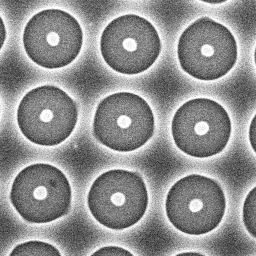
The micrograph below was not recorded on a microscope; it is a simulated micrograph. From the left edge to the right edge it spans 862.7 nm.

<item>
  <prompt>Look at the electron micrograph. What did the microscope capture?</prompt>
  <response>an array of small figures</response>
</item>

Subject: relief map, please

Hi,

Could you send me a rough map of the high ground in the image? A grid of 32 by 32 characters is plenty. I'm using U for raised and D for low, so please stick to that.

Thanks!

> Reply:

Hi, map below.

UUUUUUUUUUUUUUUUUUUUUUUUUUDUUUUU
UUUUUDDDUUUUUUUUUUUUUUUUUUUUUUUU
UUUUDDDDDDUUUUDDDDUUUUUUUDDUUUUU
DUUDDDDDDDUUUDDDDDDUUUUDDDDDUUUU
DUUDDDDDDDUUUDDDDDDDUUDDDDDDDUUU
UUUDDDDDDDUUDDDDDDDDUUDDDDDDDDUU
UUUDDDDDDDUUUDDDDDDDUUDDDDDDDDUU
UUUUDDDDDUUUUDDDDDDDUUDDDDDDDDUU
UUUUUDDUUUUUUUDDDDDUUUUDDDDDDUUU
UUUUUUUUUUUUUUUUUUUUUUUUDDDDUUUU
UUUUUUUUUUUUUUUUUUUUUUUUUUUUUUUU
UUUDDDDDUUUUUUUDUUUUUUUUUUUUUUUU
UUUDDDDDDUUUUDDDDDUUUUUUDDDUUUUU
UUDDDDDDDDUUDDDDDDDUUUDDDDDDUUUU
UUDDDDDDDDUUDDDDDDDUUUDDDDDDDUUU
UUDDDDDDDDUUDDDDDDDUUDDDDDDDDUUD
UUUDDDDDDUUUDDDDDDDUUDDDDDDDDUUD
UUUUDDDDUUUUDDDDDDDUUUDDDDDDDUUD
UUUUUUUUUUUUUUDDDUUUUUDDDDDDUUUU
UUUUUUUUUUUUUUUUUUUUUUUUDDUUUUUU
UUUUDDUUUUUUUUUUUUUUUUUUUUUUUUUU
UUDDDDDDUUUUUDDDDUUUUUUUUUUUUUUU
UUDDDDDDUUUUDDDDDDUUUUDDDDDUUUUU
UDDDDDDDDUUDDDDDDDUUUDDDDDDDUUUU
UDDDDDDDDUUDDDDDDDDUUDDDDDDDUUUD
UDDDDDDDDUUDDDDDDDUUUDDDUDDDUUDD
UUDDDDDDUUUDDDDDDDUUUDDDDDDDUUDD
UUUDDDDUUUUUDDDDDUUUUDDDDDDDUUDD
UUUUUUUUUUUUUUDDUUUUUUDDDDDUUUUD
UUUUUUUUUUUUUUUUUUUUUUUUUUUUUUUU
UUDDDDUUUUUUUUUUUUUUUUUUUUUUUUUU
UDDDDDDUUUUUDDDDUUUUUUUDDUUUUUUU